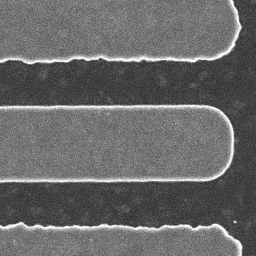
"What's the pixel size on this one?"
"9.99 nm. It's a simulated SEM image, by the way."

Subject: one or a few lines or trenches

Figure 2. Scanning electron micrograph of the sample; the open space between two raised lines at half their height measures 457 nanometers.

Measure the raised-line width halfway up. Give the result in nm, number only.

755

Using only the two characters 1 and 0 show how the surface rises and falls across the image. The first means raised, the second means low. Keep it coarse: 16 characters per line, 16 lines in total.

1111111111111110
1111111111111110
1111111111111110
1111111111111100
0000000000000000
0000000000000000
0000000000000000
1111111111111100
1111111111111110
1111111111111110
1111111111111100
0000000000000000
0000000000000000
0000000000000000
1111111111111100
1111111111111110